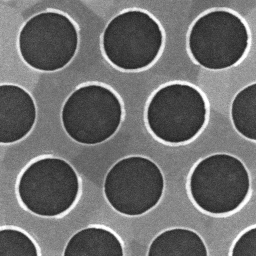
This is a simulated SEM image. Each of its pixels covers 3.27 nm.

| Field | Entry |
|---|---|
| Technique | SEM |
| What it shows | a regular array of holes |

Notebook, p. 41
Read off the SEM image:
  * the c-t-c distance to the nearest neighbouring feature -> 273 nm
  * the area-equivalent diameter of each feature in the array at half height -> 59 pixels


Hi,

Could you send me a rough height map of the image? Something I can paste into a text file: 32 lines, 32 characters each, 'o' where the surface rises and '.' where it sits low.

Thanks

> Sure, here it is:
oooooooooooooooooooooooooooooooo
oooooooooooooooo..oooooooo...ooo
oooo.....ooooo.....oooooo.....oo
ooo......oooo.......oooo.......o
oo........ooo.......oooo.......o
oo........ooo.......oooo.......o
ooo......oooo.......oooo.......o
ooo......ooooo.....ooooo......oo
oooo....ooooooo..ooooooooo..oooo
oooooooooooooooooooooooooooooooo
oooooooooooooooooooooooooooooooo
...oooooo.....oooooo.....ooooo..
....oooo.......oooo.......ooo...
....oooo.......oooo.......ooo...
....oooo.......ooo........ooo...
....oooo.......oooo......oooo...
....oooo......ooooo......ooooo..
..ooooooo....ooooooo...ooooooooo
oooooooooooooooooooooooooooooooo
oooooooooooooooooooooooooo...ooo
oooo.....oooooo....oooooo.....oo
ooo......ooooo......oooo.......o
ooo.......ooo.......oooo.......o
oo........ooo.......oooo.......o
oo........ooo.......oooo.......o
ooo......ooooo......ooooo.....oo
oooo....ooooooo...oooooooo...ooo
oooooooooooooooooooooooooooooooo
oooooooooooo.ooooooooooooooooooo
...oooooo.....oooooo.....ooooo..
....oooo.......oooo.......ooo...
.....ooo.......oooo.......ooo...